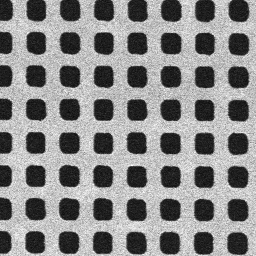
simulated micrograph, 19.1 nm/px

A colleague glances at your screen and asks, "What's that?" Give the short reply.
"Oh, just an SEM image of a regular array of holes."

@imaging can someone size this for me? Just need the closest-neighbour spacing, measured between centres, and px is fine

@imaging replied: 33.1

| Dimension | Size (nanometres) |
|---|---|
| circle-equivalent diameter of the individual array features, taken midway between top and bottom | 436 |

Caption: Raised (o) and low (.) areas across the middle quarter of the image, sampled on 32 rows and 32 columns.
..ooooooo..oooooo..oooooo...oooo
....oooo....oooo.....ooo.....ooo
....ooo.....oooo.....ooo.....ooo
....ooo.....oooo.....ooo.....ooo
....oooo....oooo.....ooo.....ooo
...ooooo....oooo.....oooo....ooo
oooooooooooooooooooooooooooooooo
oooooooooooooooooooooooooooooooo
oooooooooooooooooooooooooooooooo
....oooo....oooo.....ooo.....ooo
....ooo.....oooo.....ooo.....ooo
....ooo.....oooo.....ooo.....ooo
....ooo.....oooo.....ooo.....ooo
....oooo....oooo.....ooo.....ooo
oooooooooooooooooooooooooooooooo
oooooooooooooooooooooooooooooooo
oooooooooooooooooooooooooooooooo
...ooooo....oooo....ooooo...oooo
....ooo.....oooo....oooo.....ooo
....ooo.....oooo.....ooo.....ooo
....ooo.....oooo.....ooo.....ooo
....ooo.....oooo.....ooo.....ooo
...ooooo...ooooooo.ooooooo..oooo
oooooooooooooooooooooooooooooooo
oooooooooooooooooooooooooooooooo
...ooooo...oooooo..oooooo...oooo
....ooo.....oooo....oooo.....ooo
....ooo.....oooo.....ooo.....ooo
....ooo.....oooo.....ooo.....ooo
....ooo.....oooo.....ooo.....ooo
...ooooo....oooo....ooooo....ooo
oooooooooooooooooooooooooooooooo